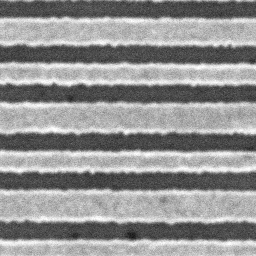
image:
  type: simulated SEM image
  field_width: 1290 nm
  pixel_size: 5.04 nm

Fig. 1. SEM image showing lines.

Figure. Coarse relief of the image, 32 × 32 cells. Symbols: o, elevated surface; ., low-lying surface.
................................
................................
oooooooooooooooooooooooooooooooo
oooooooooooooooooooooooooooooooo
oooooooooooooooooooooooooooooooo
oo.oooo..oo...oo...ooooooooooooo
................................
................................
oooooooooooooooooooooooooooooooo
oooooooooooooooooooooooooooooooo
........o..o......o.....oo.o.o..
................................
................................
oooooooooooooooooooooooooooooooo
oooooooooooooooooooooooooooooooo
oooooooooooooooooooooooooooooooo
oo...o.o.o...o.o....o.oo.ooooooo
................................
................................
oooooooooooooooooooooooooooooooo
oooooooooooooooooooooooooooooooo
................................
................................
................................
oooooooooooooooooooooooooooooooo
oooooooooooooooooooooooooooooooo
oooooooooooooooooooooooooooooooo
o.o.ooooooo.oooooooooooooooooooo
................................
................................
oooooooooooooooooooooooooooooooo
oooooooooooooooooooooooooooooooo